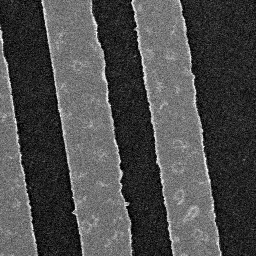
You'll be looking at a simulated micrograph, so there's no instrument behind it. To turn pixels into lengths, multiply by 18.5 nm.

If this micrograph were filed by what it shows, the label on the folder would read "one or a few lines or trenches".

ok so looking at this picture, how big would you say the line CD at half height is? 886 nm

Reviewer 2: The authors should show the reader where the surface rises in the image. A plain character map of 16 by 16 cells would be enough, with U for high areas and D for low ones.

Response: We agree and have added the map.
DDDUUUDDUUUDDDDD
DDDUUUDDDUUUDDDD
DDDUUUDDDUUUDDDD
DDDUUUDDDUUUDDDD
DDDUUUUDDUUUDDDD
UDDDUUUDDUUUDDDD
UDDDUUUDDUUUDDDD
UDDDUUUDDDUUDDDD
UDDDUUUDDDUUUDDD
UDDDUUUDDDUUUDDD
UDDDUUUUDDUUUDDD
UUDDUUUUDDUUUDDD
UUDDDUUUDDUUUDDD
UUDDDUUUDDUUUDDD
UUDDDUUUDDDUUUDD
UUDDDUUUDDDUUUDD